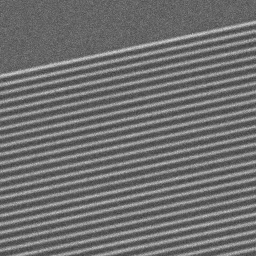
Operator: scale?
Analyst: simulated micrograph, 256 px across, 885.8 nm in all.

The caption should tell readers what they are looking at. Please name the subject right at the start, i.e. parallel lines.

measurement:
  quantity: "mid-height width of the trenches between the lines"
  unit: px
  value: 6.71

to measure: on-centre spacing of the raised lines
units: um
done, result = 0.0294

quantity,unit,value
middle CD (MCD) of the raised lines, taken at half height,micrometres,0.0084